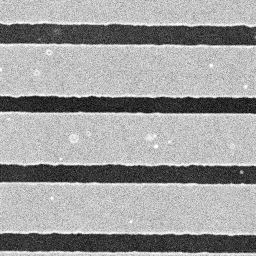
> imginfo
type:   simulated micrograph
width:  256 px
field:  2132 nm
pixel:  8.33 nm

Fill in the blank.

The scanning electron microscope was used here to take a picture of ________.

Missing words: lines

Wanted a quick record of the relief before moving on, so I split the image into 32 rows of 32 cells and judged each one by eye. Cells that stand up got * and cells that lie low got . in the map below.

********************************
********************************
********************************
................................
................................
................................
********************************
********************************
********************************
********************************
********************************
********************************
................................
................................
********************************
********************************
********************************
********************************
********************************
********************************
.****.**************************
................................
................................
********************************
********************************
********************************
********************************
********************************
********************************
................................
................................
***********.....*...............